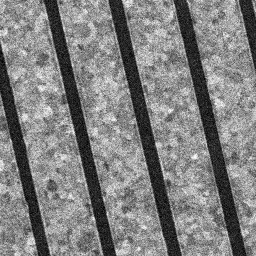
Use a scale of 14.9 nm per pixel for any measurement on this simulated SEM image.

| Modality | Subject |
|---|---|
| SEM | one or a few lines or trenches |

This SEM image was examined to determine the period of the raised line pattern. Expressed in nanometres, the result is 943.